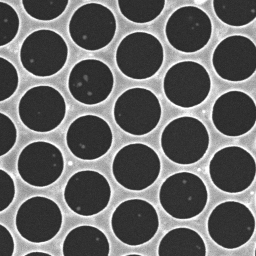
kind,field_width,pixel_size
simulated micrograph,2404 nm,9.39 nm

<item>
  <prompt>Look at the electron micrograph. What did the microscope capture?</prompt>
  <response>a regular array of holes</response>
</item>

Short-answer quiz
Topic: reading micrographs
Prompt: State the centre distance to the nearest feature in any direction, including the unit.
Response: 0.517 micrometres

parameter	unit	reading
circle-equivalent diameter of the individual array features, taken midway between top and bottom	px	47.1